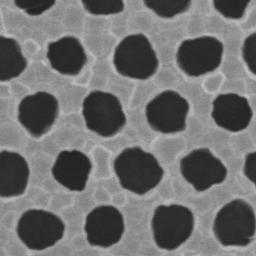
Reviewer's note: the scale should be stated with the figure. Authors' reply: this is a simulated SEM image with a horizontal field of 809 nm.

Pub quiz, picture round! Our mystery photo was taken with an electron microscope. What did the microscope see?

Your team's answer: a regular array of holes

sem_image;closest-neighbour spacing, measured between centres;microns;0.201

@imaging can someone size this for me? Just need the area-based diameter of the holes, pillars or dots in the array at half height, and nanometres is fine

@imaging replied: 132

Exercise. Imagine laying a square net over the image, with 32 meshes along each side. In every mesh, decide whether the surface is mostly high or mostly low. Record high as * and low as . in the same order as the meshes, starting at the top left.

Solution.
**.....***.....***......***....*
***..******....****....*****..**
********************************
********************************
****************..*************.
..****....*****....****.....***.
...***....****.....***......**..
...***.....***......**......***.
...****...****.....****....****.
..**************...*************
********************************
************.********.**********
***....****....****....****....*
**.....***.....***......***....*
**.....***......**.....***.....*
***...*****....****....****....*
****.*******..******.***********
********************************
********************************
...****....****....****....****.
...****....***......**......***.
....***....***......***.....***.
...****....****.....***.....***.
...*****..******...*****..******
.*******************************
****************************...*
***...*****....****.....***.....
**.....****....****.....***.....
**......***....****.....***.....
**......***....****.....***....*
***....*****..******...*****...*
********************************